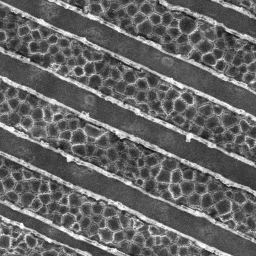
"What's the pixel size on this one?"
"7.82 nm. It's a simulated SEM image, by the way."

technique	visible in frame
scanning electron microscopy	one or a few lines or trenches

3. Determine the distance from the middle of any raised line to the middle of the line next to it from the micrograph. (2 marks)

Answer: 535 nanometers